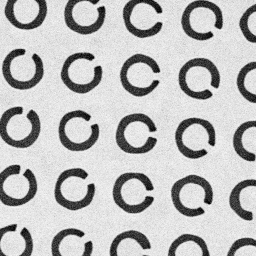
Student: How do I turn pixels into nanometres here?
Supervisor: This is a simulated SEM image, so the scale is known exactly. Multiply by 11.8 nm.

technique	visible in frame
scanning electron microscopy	an array of small figures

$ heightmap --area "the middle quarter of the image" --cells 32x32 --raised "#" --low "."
..######.#####...####...#####...
.######...####..######..#####..#
.######...####..#############..#
..#####...####..############...#
..####...#####...#####..####...#
........######....###..######..#
#......########........######...
####.###########.....#########..
################################
################################
################################
###..###########################
......##########....############
...#...#######........#########.
.#############........#######...
#######..####...#####..#####....
#######..####..######..#####...#
.######..####..#############..##
.#####...####..######..#####..##
...#....#####...####...#####..##
.......######....##....#####...#
#.....########........#######...
################....#########...
###############################.
################################
################################
.....###########################
......########......############
.###..#######........#########..
#############...###...######....
######..####...#####..#####...##
######..####..######..#####..###